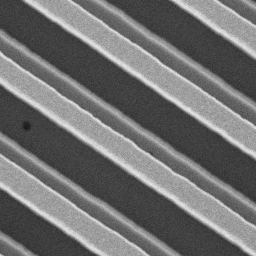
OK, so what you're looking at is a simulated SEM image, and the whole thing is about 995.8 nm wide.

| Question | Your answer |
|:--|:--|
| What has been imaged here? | lines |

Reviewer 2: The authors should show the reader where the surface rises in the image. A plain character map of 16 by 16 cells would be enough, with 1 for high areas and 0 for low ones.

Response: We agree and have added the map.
0011111000011111
0000111100000111
1000011111000011
1100000111100000
1111000011111000
1111100000111100
0011110000011111
0001111100001111
0000011110000011
1000001111100001
1110000011110000
1111000001111100
0111110000011110
0001111000001111
0000111110000011
1000001111000001